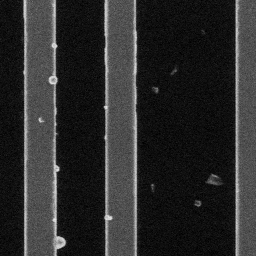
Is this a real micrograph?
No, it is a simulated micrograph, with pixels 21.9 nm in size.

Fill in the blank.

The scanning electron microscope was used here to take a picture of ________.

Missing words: lines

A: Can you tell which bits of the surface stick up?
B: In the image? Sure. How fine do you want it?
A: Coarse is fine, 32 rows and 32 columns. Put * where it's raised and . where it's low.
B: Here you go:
...****......****.............**
...****......****.............**
...****......****.............**
...****......****.............**
...****......****.............**
...****......****.............**
...****......****.............**
...****......****.............**
...****......****.............**
...****......****.............**
...****......****.............**
...****......****.............**
...****......****.............**
...****......****.............**
...****......****.............**
...****......****.............**
...****......****.............**
...****......****.............**
...****......****.............**
...****......****.............**
...****......****.............**
...****......****.............**
...****......****.............**
...****......****.............**
...****......****.............**
...****......****.............**
...****......****.............**
...****......****.............**
...****......****.............**
...****......****.............**
...*****.....****.............**
...****......****.............**